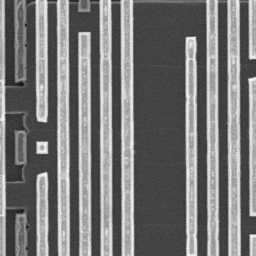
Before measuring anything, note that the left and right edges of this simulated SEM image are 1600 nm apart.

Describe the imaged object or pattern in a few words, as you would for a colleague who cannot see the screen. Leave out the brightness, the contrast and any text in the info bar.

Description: wiring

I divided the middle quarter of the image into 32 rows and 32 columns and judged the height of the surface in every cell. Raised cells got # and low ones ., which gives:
#...##...##....##..............#
#...##...##....##..............#
#...##...##....##..............#
#...##...###...##..............#
#...##...###...##..............#
#...##...###...##..............#
#...##...###...##..............#
#...##...###...##..............#
#...##...###...##..............#
#...##...###...##..............#
#...##...###...##..............#
#...##...###...##..............#
#...##...###...##..............#
#...##...###...##..............#
#...##...###...##..............#
#...##...###...##..............#
#...##...###...##..............#
#...##...###...##..............#
#...##...###...##..............#
#...##...###...##..............#
#...##...###...##..............#
#...##...###...##..............#
#...##...###...##..............#
#...##...###...##..............#
#...##...###...##..............#
#...##...###...##..............#
#...##...###...##..............#
#...##...###...##..............#
#...##...###...##..............#
#...##...###...##..............#
#...##...###...##..............#
#...##...###...##..............#